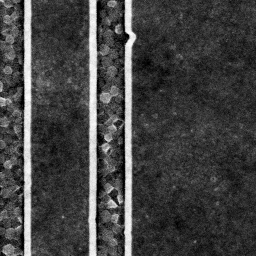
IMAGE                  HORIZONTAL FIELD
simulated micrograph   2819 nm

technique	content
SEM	one or a few lines or trenches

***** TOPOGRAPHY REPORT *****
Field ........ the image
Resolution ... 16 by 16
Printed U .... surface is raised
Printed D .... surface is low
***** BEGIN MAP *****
DDUUUUDDUUUUUUUU
DDUUUUDDUUUUUUUU
DDUUUUDDUUUUUUUU
DDUUUUDDUUUUUUUU
DDUUUUDDUUUUUUUU
DDUUUUDDUUUUUUUU
DDUUUUDDUUUUUUUU
DDUUUUDDUUUUUUUU
DDUUUUDDUUUUUUUU
DDUUUUDDUUUUUUUU
DDUUUUDDUUUUUUUU
DDUUUUDDUUUUUUUU
DDUUUUDDUUUUUUUU
DDUUUUDDUUUUUUUU
DDUUUUDDUUUUUUUU
DDUUUUDDUUUUUUUU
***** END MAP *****